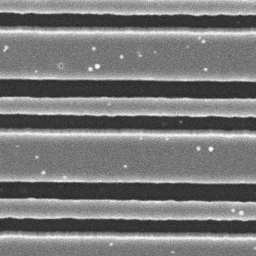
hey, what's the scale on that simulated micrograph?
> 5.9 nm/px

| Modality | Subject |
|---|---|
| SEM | lines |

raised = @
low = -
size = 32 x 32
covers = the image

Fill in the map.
@@@@@@@@@@@@@@@@@@@@@@@@@@@@@@@@
-@@@@@@@@@@@@@@@@@@@@@@@@@@@@@@@
--------------------------------
--------------------------------
@@@@@@@@@@@@@@@@@@@@@@@@@@@@@@@@
@@@@@@@@@@@@@@@@@@@@@@@@@@@@@@@@
@@@@@@@@@@@@@@@@@@@@@@@@@@@@@@@@
@@@@@@@@@@@@@@@@@@@@@@@@@@@@@@@@
@@@@@@@@@@@@@@@@@@@@@@@@@@@@@@@@
@@@@@@@@@@@@@@@@@@@@@@@@@@@@@@@@
--------------------------------
--------------------------------
@@@@@@@@@@@@@@@@@@@@@@@@@@@@@@@@
@@@@@@@@@@@@@@@@@@@@@@@@@@@@@@@@
-----------------------@@@-@@@@@
--------------------------------
@@@@@---------------------------
@@@@@@@@@@@@@@@@@@@@@@@@@@@@@@@@
@@@@@@@@@@@@@@@@@@@@@@@@@@@@@@@@
@@@@@@@@@@@@@@@@@@@@@@@@@@@@@@@@
@@@@@@@@@@@@@@@@@@@@@@@@@@@@@@@@
@@@@@@@@@@@@@@@@@@@@@@@@@@@@@@@@
@@@@@@@@@@@@@@@@@@@@@@@@@@@@@@@@
--------------------------------
--------------------------------
@@@@@@@@@@@@@@@@@@@@@@@@@@@@@@@@
@@@@@@@@@@@@@@@@@@@@@@@@@@@@@@@@
--------------------------------
--------------------------------
@@@@@@@@@@@@@@@@@@@@@@@@@@@@@@@@
@@@@@@@@@@@@@@@@@@@@@@@@@@@@@@@@
@@@@@@@@@@@@@@@@@@@@@@@@@@@@@@@@